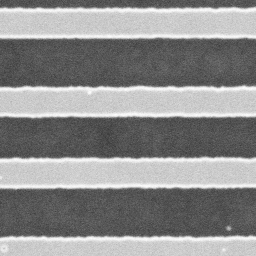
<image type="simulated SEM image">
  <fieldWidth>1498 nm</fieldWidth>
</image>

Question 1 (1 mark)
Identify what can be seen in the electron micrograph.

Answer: lines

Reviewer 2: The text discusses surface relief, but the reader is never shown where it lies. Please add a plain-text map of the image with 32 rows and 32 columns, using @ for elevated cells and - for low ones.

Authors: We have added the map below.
--------------------------------
@@@@@@@@@@@@@@@@@@@@@@@@@@@@@@@@
@@@@@@@@@@@@@@@@@@@@@@@@@@@@@@@@
@@@@@@@@@@@@@@@@@@@@@@@@@@@@@@@@
@@@@@@@@@@@@@@@@@@@@@@@@@@@@@@@@
--------------------------------
--------------------------------
--------------------------------
--------------------------------
--------------------------------
--------------------------------
@@@@@@@@@@@@@@@@@@@@@@@@@@@@@@@@
@@@@@@@@@@@@@@@@@@@@@@@@@@@@@@@@
@@@@@@@@@@@@@@@@@@@@@@@@@@@@@@@@
-@@@@@@@@@@@@@@@-@@@@@-@@@@@@@@@
--------------------------------
--------------------------------
--------------------------------
--------------------------------
--------------------------------
@@@@@@@@@@@@@@@@@@@@@@@@@@@@@@@@
@@@@@@@@@@@@@@@@@@@@@@@@@@@@@@@@
@@@@@@@@@@@@@@@@@@@@@@@@@@@@@@@@
--------------------------------
--------------------------------
--------------------------------
--------------------------------
--------------------------------
--------------------------------
--------------------------------
@@@@@@@@@@@@@@@@@@@@@@@@@@@@@@@@
@@@@@@@@@@@@@@@@@@@@@@@@@@@@@@@@